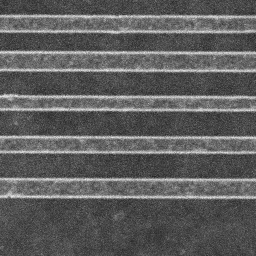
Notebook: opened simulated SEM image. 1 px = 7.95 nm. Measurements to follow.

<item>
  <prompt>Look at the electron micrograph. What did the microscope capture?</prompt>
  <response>parallel lines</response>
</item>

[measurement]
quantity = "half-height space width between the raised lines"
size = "208 nm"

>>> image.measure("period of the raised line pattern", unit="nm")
327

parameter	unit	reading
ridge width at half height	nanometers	126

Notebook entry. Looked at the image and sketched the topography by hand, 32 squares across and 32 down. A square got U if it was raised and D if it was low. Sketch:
DDDDDDDDDDDDDDDDDDDDDDDDDDDDDDDD
DDDDDDDDDDDDDDDDDDDDDDDDDDDDDDDD
UUUUUUUUUUUUUUUUUUUUUUUUUUUUUUUU
UUUUUUUUUUUUUUUUUUUUUUUUUUUUUUUU
DDDDDDDDDDDDDDDDDDDDDDDDDDDDDDDD
DDDDDDDDDDDDDDDDDDDDDDDDDDDDDDDD
DDDDDDDDDDDDDDDDDDDDDDDDDDDDDDDD
UUUUUUUUUUUUUUUUUUUUUUUUUUUUUUUU
UUUUUUUUUUUUUUUUUUUUUUUUUUUUUUUU
DDDDDDDDDDDDDDDDDDDDDDDDDDDDDDDD
DDDDDDDDDDDDDDDDDDDDDDDDDDDDDDDD
DDDDDDDDDDDDDDDDDDDDDDDDDDDDDDDD
UUUUUUUUUUUUUUUUUUUUUUUUUUUUUUUU
UUUUUUUUUUUUUUUUUUUUUUUUUUUUUUUU
DDDDDDDDDDDDDDDDDDDDDDDDDDDDDDDD
DDDDDDDDDDDDDDDDDDDDDDDDDDDDDDDD
DDDDDDDDDDDDDDDDDDDDDDDDDDDDDDDD
UUUUUUUUUUUUUUUUUUUUUUUUUUUUUUUU
UUUUUUUUUUUUUUUUUUUUUUUUUUUUUUUU
DDDDDDDDDDDDDDDDDDDDDDDDDDDDDDDD
DDDDDDDDDDDDDDDDDDDDDDDDDDDDDDDD
DDDDDDDDDDDDDDDDDDDDDDDDDDDDDDDD
UUUUUUUUUUUUUUUUUUUUUUUUUUUUUUUU
UUUUUUUUUUUUUUUUUUUUUUUUUUUUUUUU
UUUUUUUUUUUUUUUUUUUUUUUUUUUUUUUU
DDDDDDDDDDDDDDDDDDDDDDDDDDDDDDDD
DDDDDDDDDDDDDDDDDDDDDDDDDDDDDDDD
DDDDDDDDDDDDDDDDDDDDDDDDDDDDDDDD
DDDDDDDDDDDDDDDDDDDDDDDDDDDDDDDD
DDDDDDDDDDDDDDDDDDDDDDDDDDDDDDDD
DDDDDDDDDDDDDDDDDDDDDDDDDDDDDDDD
DDDDDDDDDDDDDDDDDDDDDDDDDDDDDDDD